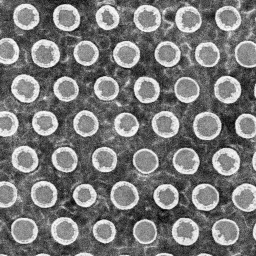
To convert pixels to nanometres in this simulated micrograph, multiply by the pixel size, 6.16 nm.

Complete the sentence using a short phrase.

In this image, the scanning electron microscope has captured a regular array of raised bodies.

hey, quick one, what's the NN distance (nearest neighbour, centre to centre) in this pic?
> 246 nanometers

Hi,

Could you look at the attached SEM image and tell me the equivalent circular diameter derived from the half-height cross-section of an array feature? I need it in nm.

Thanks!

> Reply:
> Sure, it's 154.